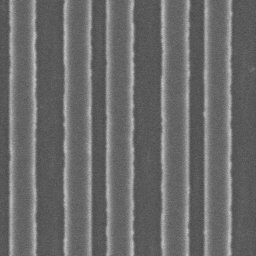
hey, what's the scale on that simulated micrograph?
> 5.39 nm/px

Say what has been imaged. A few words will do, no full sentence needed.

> lines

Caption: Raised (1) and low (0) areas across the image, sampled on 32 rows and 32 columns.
01110000111001111000111100111000
01110000111001111000111100111000
01110000111001111000111100111000
01110000111001111000111100111000
01110000111001111000111100111000
01110000111001111000111100111000
01110000111001111000111100111000
01110000111001111000111100111000
01110000111001111000111100111000
01110000111001111000111100111000
01110000111001111000111100111000
01110000111001111000111100111000
01110000111001111000111100111000
01111000111001111000111100111000
01110000111001111000111100111000
01110000111001111000111100111000
01110000111001111000111100111000
01110000111001111000111100111000
01110000111001111000111100111000
01110000111001111000111100111000
01110000111001111000111100111000
01110000111001111000111100111000
01110000111001111000111100111000
01110000111001111000111100111000
01110000111001111000111100111000
01110000111001111000111100111000
01110000111001111000111100111000
01110000111001111000111100111000
01110000111001111000111100111000
01110000111001111000111100111000
01110000111001111000111100111000
01110000111001111000111100111000